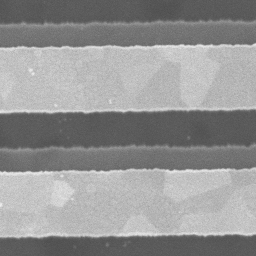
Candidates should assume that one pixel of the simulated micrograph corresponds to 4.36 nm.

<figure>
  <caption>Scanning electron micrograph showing lines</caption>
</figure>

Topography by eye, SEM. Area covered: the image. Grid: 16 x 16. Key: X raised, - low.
----------------
----XXXXXXXXXXXX
XXXXXXXXXXXXXXXX
XXXXXXXXXXXXXXXX
XXXXXXXXXXXXXXXX
XXXXXXXXXXXXXXXX
XXXXXXXXXXXXXXXX
----------------
----------------
XXXXXXXXXXXXXXXX
XXXXXXXXXXXXXXXX
XXXXXXXXXXXXXXXX
XXXXXXXXXXXXXXXX
XXXXXXXXXXXXXXXX
XXXXXXXXXXXXXXXX
----------------